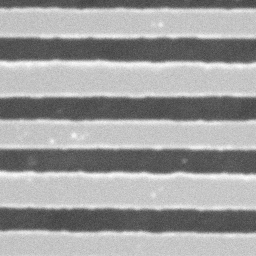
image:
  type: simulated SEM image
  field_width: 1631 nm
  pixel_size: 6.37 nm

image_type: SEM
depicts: lines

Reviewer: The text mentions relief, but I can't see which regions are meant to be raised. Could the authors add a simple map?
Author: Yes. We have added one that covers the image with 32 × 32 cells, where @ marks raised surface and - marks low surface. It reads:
--------------------------------
@@@@@@@@@@@@@@@@@@@@@@@@@@@@@@@@
@@@@@@@@@@@@@@@@@@@@@@@@@@@@@@@@
@@@@@@@@@@@@@@@@@@@@@@@@@@@@@@@@
@@@@@@@@@@@@@@@@@@@@@@@@@@@@@@@@
--------------------------------
--------------------------------
--------------------------------
@@@@@@@@@@@@@@@@@@@@@@@@@@@@@@@@
@@@@@@@@@@@@@@@@@@@@@@@@@@@@@@@@
@@@@@@@@@@@@@@@@@@@@@@@@@@@@@@@@
@@@@@@@@@@@@@@@@@@@@@@@@@@@@@@@@
--------------------------------
--------------------------------
--------------------------------
@@@@@@@@@@@@@@@@@@@@@@@@@@@@@@@@
@@@@@@@@@@@@@@@@@@@@@@@@@@@@@@@@
@@@@@@@@@@@@@@@@@@@@@@@@@@@@@@@@
-------@@-----@----@---@@@@@@@@@
--------------------------------
--------------------------------
--------------------------------
@@@@@@@@@@@@@@@@@@@@@@@@@@@@@@@@
@@@@@@@@@@@@@@@@@@@@@@@@@@@@@@@@
@@@@@@@@@@@@@@@@@@@@@@@@@@@@@@@@
@@@@@@@@@@@@@@@@@@@@@@@@@@@@@@@@
--------------------------------
--------------------------------
--------------------------------
@@@@@@@@@@@@@@@@@@@@@@@@@@@@@@@@
@@@@@@@@@@@@@@@@@@@@@@@@@@@@@@@@
@@@@@@@@@@@@@@@@@@@@@@@@@@@@@@@@